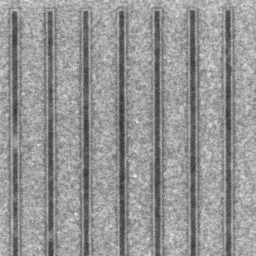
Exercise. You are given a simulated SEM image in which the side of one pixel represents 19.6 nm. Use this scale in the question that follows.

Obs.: parallel lines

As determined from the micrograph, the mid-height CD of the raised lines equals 137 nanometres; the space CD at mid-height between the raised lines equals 556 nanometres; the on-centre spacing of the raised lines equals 0.698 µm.